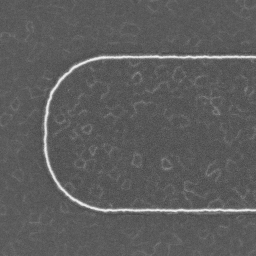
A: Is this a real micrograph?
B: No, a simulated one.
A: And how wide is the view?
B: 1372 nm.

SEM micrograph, one or a few lines or trenches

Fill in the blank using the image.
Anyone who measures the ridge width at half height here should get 154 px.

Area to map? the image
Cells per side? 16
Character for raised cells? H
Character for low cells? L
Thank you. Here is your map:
LLLLLLLLLLLLLLLL
LLLLLLLLLLLLLLLL
LLLLLLLLLLLLLLLL
LLLLLLLLLLLLLLLL
LLLLHHHHHHHHHHHH
LLLHHHHHHHHHHHHH
LLLHHHHHHHHHHHHH
LLLHHHHHHHHHHHHH
LLLHHHHHHHHHHHHH
LLLHHHHHHHHHHHHH
LLLHHHHHHHHHHHHH
LLLLHHHHHHHHHHHH
LLLLLHHHHHHHHHHH
LLLLLLLLLLLLLLLL
LLLLLLLLLLLLLLLL
LLLLLLLLLLLLLLLL